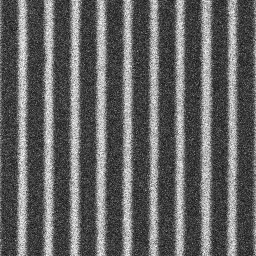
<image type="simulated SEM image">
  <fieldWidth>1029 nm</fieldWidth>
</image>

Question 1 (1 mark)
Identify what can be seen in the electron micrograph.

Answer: parallel lines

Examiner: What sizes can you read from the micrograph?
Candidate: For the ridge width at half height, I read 25.1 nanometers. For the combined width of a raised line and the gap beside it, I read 106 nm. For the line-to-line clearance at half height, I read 78.4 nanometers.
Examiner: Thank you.